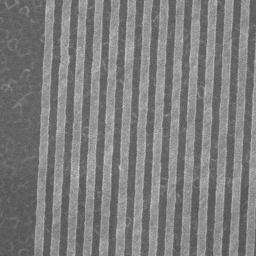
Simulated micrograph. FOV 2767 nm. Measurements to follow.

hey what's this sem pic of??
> parallel lines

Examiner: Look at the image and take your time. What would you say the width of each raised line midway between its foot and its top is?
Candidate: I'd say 81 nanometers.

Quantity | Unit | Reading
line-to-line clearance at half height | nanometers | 91.8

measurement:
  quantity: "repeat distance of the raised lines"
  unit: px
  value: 16.2